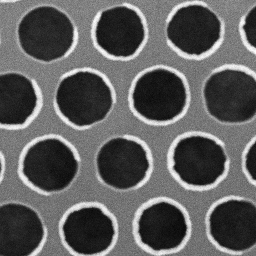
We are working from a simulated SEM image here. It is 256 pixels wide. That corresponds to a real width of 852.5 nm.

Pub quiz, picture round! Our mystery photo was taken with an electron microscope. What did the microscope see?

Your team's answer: a regular array of holes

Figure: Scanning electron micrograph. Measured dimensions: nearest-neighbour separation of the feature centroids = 74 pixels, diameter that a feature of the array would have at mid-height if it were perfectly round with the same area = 170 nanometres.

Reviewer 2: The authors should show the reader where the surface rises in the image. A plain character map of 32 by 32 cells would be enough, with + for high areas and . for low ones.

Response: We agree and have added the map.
++++++++++++++++++++++++++++++++
++++....+++++....+++++.....++++.
+++......+++......+++......++++.
++.......+++......+++.......++..
++.......+++......+++......++++.
+++......+++......++++.....++++.
+++.....+++++....++++++...++++++
+++++..+++++++++++++++++++++++++
++++++++++++++++++++++++++++++++
...++++++...++++++....++++.....+
....+++......++++......+++......
....+++.......+++......++.......
.....++.......+++......+++......
....+++.......+++......+++......
....++++.....+++++....+++++.....
..+++++++..+++++++++++++++++++++
++++++++++++++++++++++++++++++++
++++++.+++++++..+++++++....+++++
++++.....++++.....++++......+++.
+++......+++......++++......+++.
+++.......++.......+++......+++.
+++.......++......++++......+++.
++++.....++++.....+++++....+++++
+++++...+++++++.++++++++++++++++
++++++++++++++++++++++++++++++++
+.+++++++++++++++++..+++++++....
....+++++....+++++.....++++.....
.....+++......+++......+++......
.....+++......+++......+++......
.....+++......+++......++++.....
.....++++.....++++....+++++.....
....++++++...+++++++++++++++++++